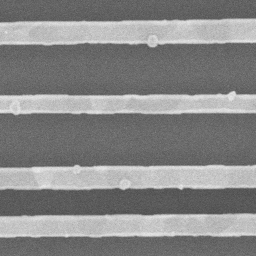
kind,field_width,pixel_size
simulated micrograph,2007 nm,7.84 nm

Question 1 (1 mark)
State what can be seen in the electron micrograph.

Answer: lines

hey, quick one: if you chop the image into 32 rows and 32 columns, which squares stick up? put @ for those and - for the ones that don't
--------------------------------
--------------------------------
----------------------------@@@@
@@@@@@@@@@@@@@@@@@@@@@@@@@@@@@@@
@@@@@@@@@@@@@@@@@@@@@@@@@@@@@@@@
------------------@@------------
--------------------------------
--------------------------------
--------------------------------
--------------------------------
--------------------------------
--------------------------------
@@@@@@@@@@@@@@@@@@@@@@@@@@@@@@@@
@@@@@@@@@@@@@@@@@@@@@@@@@@@@@@@@
--------------------------------
--------------------------------
--------------------------------
--------------------------------
--------------------------------
--------------------------------
--------------------------------
@@@@@@@@@@@@@@@@@@@@@@@@@@@@@@@@
@@@@@@@@@@@@@@@@@@@@@@@@@@@@@@@@
@-@@@--@@@@@---@------@---------
--------------------------------
--------------------------------
--------------------------------
@@@@@@@@@@@@@@@@@@@@@@@@@@@@@@@@
@@@@@@@@@@@@@@@@@@@@@@@@@@@@@@@@
--------@-----------------------
--------------------------------
--------------------------------